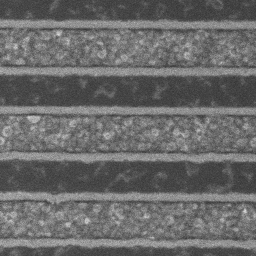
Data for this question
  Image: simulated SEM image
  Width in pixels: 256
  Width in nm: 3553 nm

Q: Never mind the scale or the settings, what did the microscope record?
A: one or a few lines or trenches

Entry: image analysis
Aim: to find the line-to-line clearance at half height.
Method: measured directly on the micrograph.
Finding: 656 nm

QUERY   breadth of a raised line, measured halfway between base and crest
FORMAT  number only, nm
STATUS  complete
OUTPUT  534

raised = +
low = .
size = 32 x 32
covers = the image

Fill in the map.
++++++++++++++++++++++++++++++++
++++++++++++++++++++++++++++++++
++++++++++++++++++++++++++++++++
................................
................................
................................
................................
................................
................................
++++++++++++++++++++++++++++++++
++++++++++++++++++++++++++++++++
++++++++++++++++++++++++++++++++
++++++++++++++++++++++++++++++++
++++++++++++++++++++++++++++++++
................................
................................
................................
................................
................................
................................
++++++++++++++++++++++++++++++++
++++++++++++++++++++++++++++++++
++++++++++++++++++++++++++++++++
++++++++++++++++++++++++++++++++
.....++++...++++++++++++++++++++
................................
................................
................................
................................
................................
++++++++++++++++++++..++++.++...
++++++++++++++++++++++++++++++++